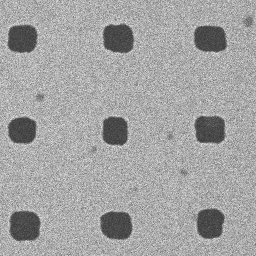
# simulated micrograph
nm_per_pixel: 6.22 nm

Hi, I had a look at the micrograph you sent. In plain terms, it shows a regular array of holes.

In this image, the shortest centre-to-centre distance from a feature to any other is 570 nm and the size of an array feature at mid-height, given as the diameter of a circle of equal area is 192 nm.